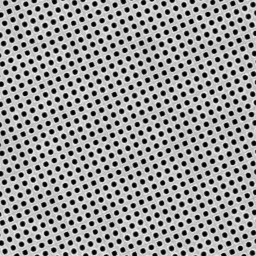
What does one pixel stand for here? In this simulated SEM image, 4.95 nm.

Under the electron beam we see a regular array of holes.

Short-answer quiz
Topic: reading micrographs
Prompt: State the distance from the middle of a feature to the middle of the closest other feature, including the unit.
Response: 8.87 pixels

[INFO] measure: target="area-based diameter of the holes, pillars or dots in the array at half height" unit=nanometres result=27.9